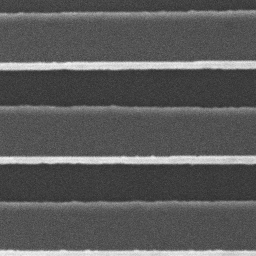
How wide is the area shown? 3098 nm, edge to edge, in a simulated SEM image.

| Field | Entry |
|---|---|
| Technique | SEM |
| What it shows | lines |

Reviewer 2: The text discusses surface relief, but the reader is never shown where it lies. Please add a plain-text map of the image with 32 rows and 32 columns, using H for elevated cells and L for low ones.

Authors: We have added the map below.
LLLLLLLLLLLLLLLLLLLLLLLLLLLLLLLL
LLLLLLLLLLLLLLLLLLLLHLLHHHHHHHHH
HHHHHHHHHHHHHHHHHHHHHHHHHHHHHHHH
HHHHHHHHHHHHHHHHHHHHHHHHHHHHHHHH
HHHHHHHHHHHHHHHHHHHHHHHHHHHHHHHH
HHHHHHHHHHHHHHHHHHHHHHHHHHHHHHHH
HHHHHHHHHHHHHHHHHHHHHHHHHHHHHHHH
HHHHHHHHHHHHHHHHHHHHHHHHHHHHHHHH
HHHHHHHHHHHHHHHHHHHHHHHHHHHHHHHH
LLLLLLLLLLLLLLLLLLLLLLLLLLLLLLLL
LLLLLLLLLLLLLLLLLLLLLLLLLLLLLLLL
LLLLLLLLLLLLLLLLLLLLLLLLLLLLLLLL
LLLLLLLLLLLLLLLLLLLLLLLLLLLLLLLL
HHHHHHHHHHHHHHHHHHHHLHHHHLLLHHHH
HHHHHHHHHHHHHHHHHHHHHHHHHHHHHHHH
HHHHHHHHHHHHHHHHHHHHHHHHHHHHHHHH
HHHHHHHHHHHHHHHHHHHHHHHHHHHHHHHH
HHHHHHHHHHHHHHHHHHHHHHHHHHHHHHHH
HHHHHHHHHHHHHHHHHHHHHHHHHHHHHHHH
HHHHHHHHHHHHHHHHHHHHHHHHHHHHHHHH
LLLLLLLLLLLLLLLLLLLLLLLLLLLLLLLL
LLLLLLLLLLLLLLLLLLLLLLLLLLLLLLLL
LLLLLLLLLLLLLLLLLLLLLLLLLLLLLLLL
LLLLLLLLLLLLLLLLLLLLLLLLLLLLLLLL
LLLLLLLLLLLLLLLLLLLLLLLLLLLLLLLL
HHHHHHHHHHHHHHHHHHHHHHHHHHHHHHHH
HHHHHHHHHHHHHHHHHHHHHHHHHHHHHHHH
HHHHHHHHHHHHHHHHHHHHHHHHHHHHHHHH
HHHHHHHHHHHHHHHHHHHHHHHHHHHHHHHH
HHHHHHHHHHHHHHHHHHHHHHHHHHHHHHHH
HHHHHHHHHHHHHHHHHHHHHHHHHHHHHHHH
HHHHHHHHHHHHHHHHHHHHHHHHHHHHHHHH